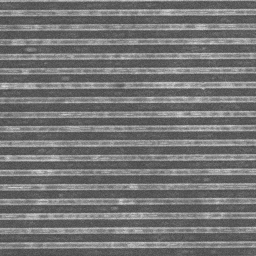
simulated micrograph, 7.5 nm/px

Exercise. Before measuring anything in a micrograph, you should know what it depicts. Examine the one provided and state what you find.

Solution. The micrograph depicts parallel lines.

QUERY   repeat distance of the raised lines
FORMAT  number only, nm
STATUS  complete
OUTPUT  109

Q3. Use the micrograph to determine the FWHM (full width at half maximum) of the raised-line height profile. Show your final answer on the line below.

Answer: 5.63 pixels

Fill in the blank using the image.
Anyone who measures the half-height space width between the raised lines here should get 69.4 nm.